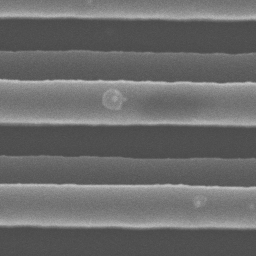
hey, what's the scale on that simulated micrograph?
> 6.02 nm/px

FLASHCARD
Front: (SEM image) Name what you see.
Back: lines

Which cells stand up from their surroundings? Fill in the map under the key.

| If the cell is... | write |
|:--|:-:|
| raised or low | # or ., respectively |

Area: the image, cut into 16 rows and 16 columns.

################
................
................
################
################
################
################
################
................
................
################
################
################
################
................
................